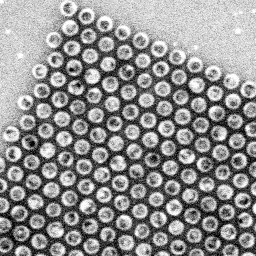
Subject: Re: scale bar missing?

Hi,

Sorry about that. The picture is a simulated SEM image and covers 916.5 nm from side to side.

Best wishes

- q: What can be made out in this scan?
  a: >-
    a regular array of raised bodies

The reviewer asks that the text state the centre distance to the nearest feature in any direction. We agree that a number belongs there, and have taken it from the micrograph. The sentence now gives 70.3 nm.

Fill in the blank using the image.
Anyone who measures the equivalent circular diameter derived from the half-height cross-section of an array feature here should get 48.5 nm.